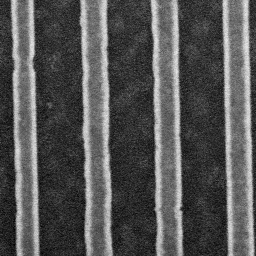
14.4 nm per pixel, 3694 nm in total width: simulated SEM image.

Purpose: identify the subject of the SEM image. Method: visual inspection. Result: one or a few lines or trenches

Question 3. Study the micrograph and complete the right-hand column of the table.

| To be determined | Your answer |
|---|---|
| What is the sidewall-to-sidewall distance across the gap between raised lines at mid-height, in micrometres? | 0.74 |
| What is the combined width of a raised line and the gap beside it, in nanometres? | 1030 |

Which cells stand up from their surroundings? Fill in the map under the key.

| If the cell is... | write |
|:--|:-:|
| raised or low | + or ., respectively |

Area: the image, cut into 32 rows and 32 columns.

..++......+++......+++......+++.
..++......+++......+++......+++.
..++......+++......+++......+++.
..++.......++......+++......+++.
..++.......++......+++......+++.
..++.......++.......++......+++.
..++.......++.......++......+++.
..++.......++......+++......+++.
..++.......++......+++......+++.
..++.......++.......++......+++.
..++.......++.......++......+++.
..++.......++.......++......+++.
..++.......++.......++......+++.
..++.......++.......++......+++.
..++.......++.......++.......++.
..++.......++.......++.......++.
..++.......++.......++.......++.
..++.......++.......++.......++.
..++.......++.......++.......++.
..++.......++.......++.......++.
..++.......++.......++.......++.
..++.......++.......++.......++.
..++.......++.......++.......++.
..++.......+++......++.......++.
..++.......+++......++.......++.
..++.......++.......++.......++.
..++.......++.......++.......++.
..++.......++.......++.......++.
..++.......++.......++.......++.
..++.......+++......++.......++.
..++.......+++......++.......++.
..+++......+++......+++......++.